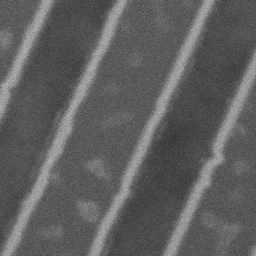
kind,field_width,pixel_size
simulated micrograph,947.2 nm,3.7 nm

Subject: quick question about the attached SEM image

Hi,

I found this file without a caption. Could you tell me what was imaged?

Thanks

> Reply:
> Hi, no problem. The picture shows one or a few lines or trenches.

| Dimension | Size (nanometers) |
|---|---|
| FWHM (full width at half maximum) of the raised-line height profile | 292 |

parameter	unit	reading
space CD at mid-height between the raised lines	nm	252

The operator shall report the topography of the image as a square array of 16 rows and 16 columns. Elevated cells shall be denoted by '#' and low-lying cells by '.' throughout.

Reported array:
###....######...
##.....#####....
##.....#####....
#.....######....
#.....#####.....
.....######....#
.....#####.....#
....######....##
....#####.....##
...######.....##
...#####.....###
..######.....###
..#####.....####
..#####.....####
.#####.....#####
.#####.....#####